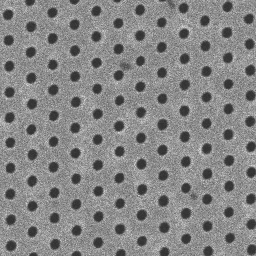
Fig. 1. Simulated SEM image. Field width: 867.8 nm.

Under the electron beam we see a regular array of holes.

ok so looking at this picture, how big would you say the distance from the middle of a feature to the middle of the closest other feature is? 84.3 nanometers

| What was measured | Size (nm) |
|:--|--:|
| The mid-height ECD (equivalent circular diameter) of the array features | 32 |